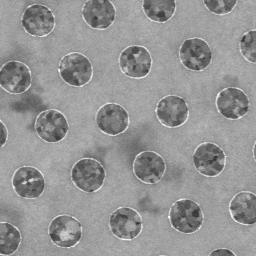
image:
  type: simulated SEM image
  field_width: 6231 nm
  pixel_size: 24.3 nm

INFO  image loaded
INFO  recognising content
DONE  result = a regular array of raised bodies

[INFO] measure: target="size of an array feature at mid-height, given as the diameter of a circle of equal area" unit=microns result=0.802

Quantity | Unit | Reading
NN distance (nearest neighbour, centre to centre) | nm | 1470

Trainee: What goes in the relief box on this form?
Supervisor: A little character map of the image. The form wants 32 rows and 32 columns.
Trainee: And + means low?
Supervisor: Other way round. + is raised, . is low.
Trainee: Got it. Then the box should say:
...........+++....++++....+++...
...+++....++++....++++....+++...
...++++....+++.....++...........
...++++.....+...................
..............................++
.......................+++....++
...............++++...++++....++
........+++....++++....+++.....+
+++....++++....++++....+++......
++++....+++.....++..............
++++.....++.....................
.++.........................++..
....................+++....++++.
.............++.....+++....++++.
.....+++....++++....+++.....++..
....+++++...++++....+++.........
+....+++.....++.................
+.....++........................
.........................+++....
.................+++....++++....
.........+++.....++++...++++....
..+++....++++....++++....+++....
..++++...++++.....++............
..++++....++....................
...++........................+++
......................+++....+++
..............+++....++++....+++
.......+++....++++...++++....+++
++....++++....++++....+++.......
+++...++++....+++...............
++.....+++......................
++........................+++...